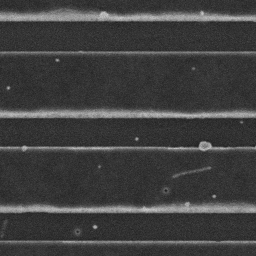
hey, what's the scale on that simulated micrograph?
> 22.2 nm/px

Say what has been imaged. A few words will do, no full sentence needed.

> lines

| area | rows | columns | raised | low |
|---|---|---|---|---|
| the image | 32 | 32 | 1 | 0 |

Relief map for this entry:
11111111111111111111111111111111
11111111111111111111111111111111
00000000000000000000000000000000
00000000000000000000000000000000
00000000000000000000000000000000
00000000000000000000000000000000
00000000000000000000000000000000
11111111111111111111111111111111
11111111111111111111111111111111
11111111111111111111111111111111
11111111111111111111111111111111
11111111111111111111111111111111
11111111111111111111111111111111
11111111111111111111111111111111
00010000000000000111111111111111
00000000000000000000000000000000
00000000000000000000000000000000
00000000000000000000000000000000
11111110000000000000000011100001
11111111111111111111111111111111
11111111111111111111111111111111
11111111111111111111111111111111
11111111111111111111111111111111
11111111111111111111111111111111
11111111111111111111111111111111
11111111111111111111111111111111
00000000000000000000000000000000
00000000000000000000000000000000
00000000000000000000000000000000
00000000000000000000000000000000
11111111111111111111111111111111
11111111111111111111111111111111